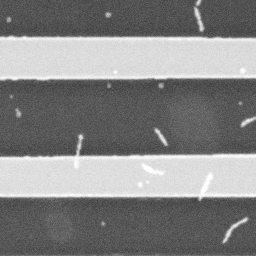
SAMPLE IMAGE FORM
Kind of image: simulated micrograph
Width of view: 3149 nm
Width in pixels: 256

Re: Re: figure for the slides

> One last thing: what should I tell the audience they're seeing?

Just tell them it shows lines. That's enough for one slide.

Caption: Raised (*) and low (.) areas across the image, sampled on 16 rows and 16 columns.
................
................
****************
****************
****************
................
................
................
................
................
****************
****************
................
................
................
................